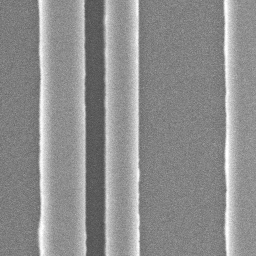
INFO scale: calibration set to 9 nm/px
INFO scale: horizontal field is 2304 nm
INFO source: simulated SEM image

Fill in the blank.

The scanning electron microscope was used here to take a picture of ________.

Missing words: lines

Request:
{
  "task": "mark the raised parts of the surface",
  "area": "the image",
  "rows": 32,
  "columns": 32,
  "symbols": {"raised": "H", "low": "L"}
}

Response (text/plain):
LLLLLHHHHHLLLHHHHLLLLLLLLLLLHHHH
LLLLLHHHHHLLLHHHHLLLLLLLLLLLHHHH
LLLLLHHHHHLLLHHHHLLLLLLLLLLLHHHH
LLLLLHHHHHLLLHHHHLLLLLLLLLLLHHHH
LLLLLHHHHHLLLHHHHLLLLLLLLLLLHHHH
LLLLLHHHHHLLLHHHHLLLLLLLLLLLHHHH
LLLLLHHHHHLLLHHHHLLLLLLLLLLLHHHH
LLLLLHHHHHLLLHHHHLLLLLLLLLLLHHHH
LLLLLHHHHHLLLHHHHLLLLLLLLLLLHHHH
LLLLLHHHHHHLLHHHHLLLLLLLLLLLHHHH
LLLLLHHHHHLLLHHHHLLLLLLLLLLLHHHH
LLLLLHHHHHLLLHHHHLLLLLLLLLLLHHHH
LLLLLHHHHHLLLHHHHLLLLLLLLLLLHHHH
LLLLLHHHHHHLLHHHHLLLLLLLLLLLHHHH
LLLLLHHHHHHLLHHHHLLLLLLLLLLLHHHH
LLLLLHHHHHHLLHHHHLLLLLLLLLLLHHHH
LLLLLHHHHHHLLHHHHLLLLLLLLLLLHHHH
LLLLLHHHHHHLLHHHHLLLLLLLLLLLHHHH
LLLLLHHHHHHLLHHHHLLLLLLLLLLLHHHH
LLLLLHHHHHHLLHHHHLLLLLLLLLLLHHHH
LLLLLHHHHHHLLHHHHLLLLLLLLLLLHHHH
LLLLLHHHHHHLLHHHHLLLLLLLLLLLHHHH
LLLLLHHHHHHLLHHHHLLLLLLLLLLLLHHH
LLLLLHHHHHHLLHHHHLLLLLLLLLLLLHHH
LLLLLHHHHHHLLHHHHLLLLLLLLLLLHHHH
LLLLLHHHHHHLLHHHHLLLLLLLLLLLLHHH
LLLLLHHHHHHLLHHHHLLLLLLLLLLLLHHH
LLLLLHHHHHHLLHHHHLLLLLLLLLLLLHHH
LLLLLHHHHHHLLHHHHLLLLLLLLLLLLHHH
LLLLLHHHHHHLLHHHHLLLLLLLLLLLLHHH
LLLLLHHHHHHLLHHHHLLLLLLLLLLLLHHH
LLLLLHHHHHHLLHHHHLLLLLLLLLLLLHHH